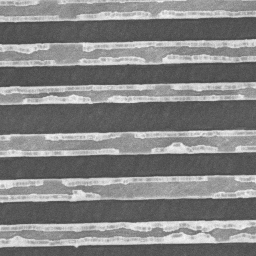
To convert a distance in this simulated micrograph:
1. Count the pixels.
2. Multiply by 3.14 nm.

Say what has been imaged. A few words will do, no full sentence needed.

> parallel lines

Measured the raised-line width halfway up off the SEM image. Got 68.3 nanometers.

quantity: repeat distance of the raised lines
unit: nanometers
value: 142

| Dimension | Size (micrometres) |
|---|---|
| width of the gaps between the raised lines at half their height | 0.0742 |